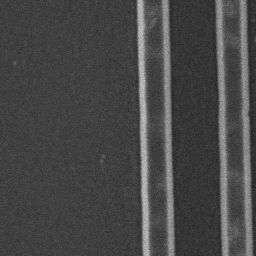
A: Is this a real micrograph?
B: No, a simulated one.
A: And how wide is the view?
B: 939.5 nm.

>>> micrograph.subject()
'one or a few lines or trenches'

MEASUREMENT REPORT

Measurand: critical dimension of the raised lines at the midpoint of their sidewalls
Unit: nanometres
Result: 91.2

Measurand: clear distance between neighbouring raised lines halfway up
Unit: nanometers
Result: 192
